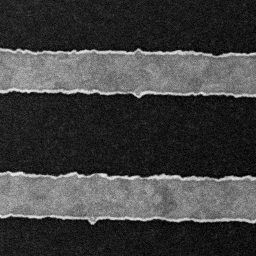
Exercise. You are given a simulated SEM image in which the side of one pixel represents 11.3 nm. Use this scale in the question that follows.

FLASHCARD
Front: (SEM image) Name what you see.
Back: one or a few lines or trenches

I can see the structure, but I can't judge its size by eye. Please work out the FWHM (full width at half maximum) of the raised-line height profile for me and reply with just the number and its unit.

464 nm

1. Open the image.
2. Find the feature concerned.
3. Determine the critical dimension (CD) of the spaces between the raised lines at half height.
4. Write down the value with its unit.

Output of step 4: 949 nm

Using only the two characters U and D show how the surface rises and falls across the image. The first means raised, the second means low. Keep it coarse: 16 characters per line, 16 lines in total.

DDDDDDDDDDDDDDDD
DDDDDDDDDDDDDDDD
DDDDDDDDDDDDDDDD
UUUUUUUUUUUUUUUU
UUUUUUUUUUUUUUUU
UUUUUUUUUUUUUUUU
DDDDDDDDDDDDDDDD
DDDDDDDDDDDDDDDD
DDDDDDDDDDDDDDDD
DDDDDDDDDDDDDDDD
DDDDDDDDDDDDDDDD
UUUUUUUUUUUUUUUU
UUUUUUUUUUUUUUUU
UUUUUUUUUUUUUUUU
DDDDDDDDDDDDDDDD
DDDDDDDDDDDDDDDD